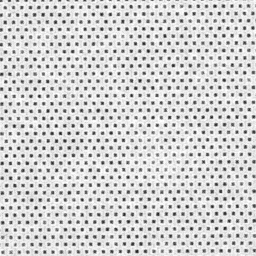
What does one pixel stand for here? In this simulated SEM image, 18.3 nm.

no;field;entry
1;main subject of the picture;a regular array of holes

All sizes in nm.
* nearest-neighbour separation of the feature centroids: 149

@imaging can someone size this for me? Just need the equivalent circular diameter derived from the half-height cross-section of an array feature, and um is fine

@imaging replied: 0.0899